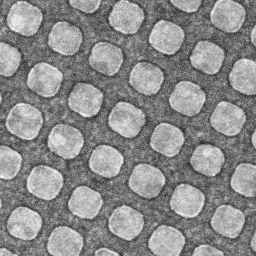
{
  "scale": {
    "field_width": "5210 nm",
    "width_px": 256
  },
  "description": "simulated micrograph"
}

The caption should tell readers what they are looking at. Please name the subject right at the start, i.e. a regular array of raised bodies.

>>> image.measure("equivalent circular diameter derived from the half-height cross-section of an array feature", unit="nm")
652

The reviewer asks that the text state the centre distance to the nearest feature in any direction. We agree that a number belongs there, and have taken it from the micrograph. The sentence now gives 45.3 pixels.